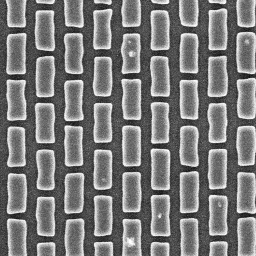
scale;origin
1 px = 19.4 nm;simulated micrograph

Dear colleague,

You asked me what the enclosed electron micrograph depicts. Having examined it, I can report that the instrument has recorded groups of lines, slits or small figures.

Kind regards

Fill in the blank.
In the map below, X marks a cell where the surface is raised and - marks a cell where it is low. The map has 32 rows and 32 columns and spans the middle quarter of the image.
XXXX----XXXX---XXXX---XXXX---XXX
XXXX----XXXX--XXXXX---XXXX---XXX
--------XXXX----------XXXX------
--------XXXX----------XXXX------
-XXXX--XXXXX--XXXXX---XXXX---XXX
XXXXX--XXXXX---XXXX---XXXX---XXX
XXXX---XXXXX---XXXX---XXXX---XXX
XXXX----XXXX---XXXX---XXXX---XXX
XXXX-----------XXXX----------XXX
XXXX-----------XXXX----------XXX
XXXX----XXXX---XXXX---XXXX---XXX
XXXX----XXXX---XXXX---XXXX---XXX
XXXXX---XXXX---XXXX---XXXX---XXX
XXXXX---XXXX---XXXX---XXXX----XX
--------XXXX----------XXXX------
--------XXXX----------XXXX------
XXXX----XXXX---XXXX---XXXX---XXX
XXXX----XXXX---XXXX---XXXX---XXX
XXXX----XXXX---XXXX---XXXX---XXX
XXXX----XX-----XXXX---XXXX---XXX
XXXX-----------XXXX----------XXX
XXXX-----------XXXX---XX-----XXX
XXXX----XXXX---XXXX---XXXX---XXX
XXXX----XXXX---XXXX---XXXX---XXX
XXXXX---XXXX---XXXX---XXXX---XXX
-X------XXXX---XX-----XXXX-----X
--------XXXX----------XXXX------
-XXX----XXXX---XXXX---XXXX---XXX
XXXXX---XXXX---XXXX---XXXX---XXX
XXXXX---XXXX---XXXX---XXXX---XXX
XXXXX---XXXX---XXXX---XXXX---XXX
XXXXX----------XXXX----------XXX